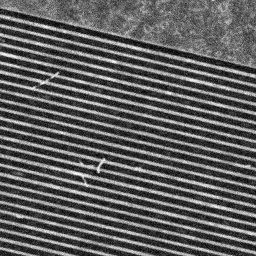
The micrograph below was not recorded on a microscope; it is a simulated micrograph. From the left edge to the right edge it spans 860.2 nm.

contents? parallel lines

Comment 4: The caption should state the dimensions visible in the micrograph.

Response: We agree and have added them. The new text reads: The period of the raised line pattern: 30.4 nanometers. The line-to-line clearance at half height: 21.7 nm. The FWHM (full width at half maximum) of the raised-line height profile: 7.8 nm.